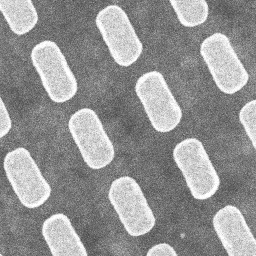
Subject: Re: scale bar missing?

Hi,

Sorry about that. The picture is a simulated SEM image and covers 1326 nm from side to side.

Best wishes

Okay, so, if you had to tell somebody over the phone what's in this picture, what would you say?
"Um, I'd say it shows a regular array of raised bodies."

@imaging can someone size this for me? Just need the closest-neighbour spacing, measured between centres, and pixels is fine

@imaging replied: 75.6